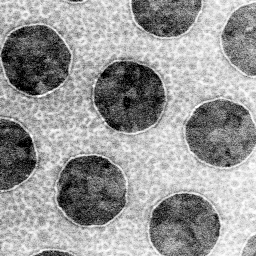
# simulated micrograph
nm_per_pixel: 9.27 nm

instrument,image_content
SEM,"raised bodies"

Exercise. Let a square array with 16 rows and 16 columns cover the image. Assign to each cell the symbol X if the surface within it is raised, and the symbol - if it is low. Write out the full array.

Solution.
--------XXXXX--X
---------XXX--XX
XXXX----------XX
XXXX----------XX
XXXX--XXXX-----X
-XXX--XXXX------
------XXXX---XX-
X-----XXXX--XXXX
XX----------XXXX
XX----------XXXX
XX--XXX---------
X---XXXX--------
----XXXX--XXX---
----XXX--XXXXX--
---------XXXXX--
----------XXX--X